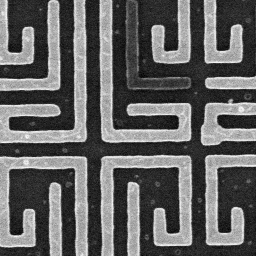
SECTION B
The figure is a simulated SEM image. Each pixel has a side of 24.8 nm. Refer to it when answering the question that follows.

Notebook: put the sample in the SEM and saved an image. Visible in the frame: wiring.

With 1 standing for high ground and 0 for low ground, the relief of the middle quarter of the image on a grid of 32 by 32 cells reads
00011000011100001100000000000000
00011000011100001100000000000000
00011000011100001100000000000000
00011000011100001110000000000000
00011000011100001111111111111111
00011000011100001111111111111110
00011000011100000000000000000000
00011100011100000000000000000000
00011100011100000000000000000000
00011000011100000000000000000000
00011000011100001111111111111110
00011000011100001111111111111111
00011000011100001111111111111111
00011000001100000000000000000110
00011000001100000000000000000110
00011000001100000000000000000110
00111100001110000000000000001111
11111100001111111111111111111111
11111100001111111111111111111111
10000000000111000000000000000000
00000000000000000000000000000000
00000000000000000000000000000000
00000000000000000000000000000000
11111000001111111111111111111110
11111100001111111111111111111111
11111100001111111111111111111111
00011100011100000000000000000111
00011100011100000000000000000111
00011100011100000000000000000111
00011100011100000000000000000111
00011100011100001110000000000111
00011100011100001110000000000111